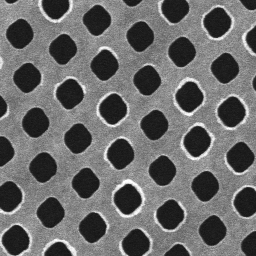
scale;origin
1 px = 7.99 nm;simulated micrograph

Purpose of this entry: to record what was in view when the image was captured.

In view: a regular array of holes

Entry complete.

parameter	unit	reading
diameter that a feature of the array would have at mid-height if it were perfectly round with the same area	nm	222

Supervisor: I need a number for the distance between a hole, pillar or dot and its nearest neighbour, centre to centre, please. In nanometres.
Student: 357